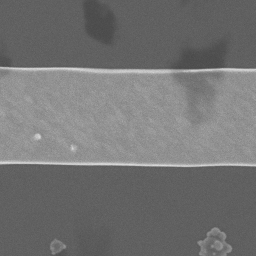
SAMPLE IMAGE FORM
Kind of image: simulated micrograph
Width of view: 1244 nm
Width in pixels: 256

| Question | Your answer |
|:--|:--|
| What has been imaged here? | wiring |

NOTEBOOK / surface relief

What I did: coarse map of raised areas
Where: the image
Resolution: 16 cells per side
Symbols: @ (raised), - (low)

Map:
----------------
----------------
----------------
----------------
@@@@@@@@@@@@@@@@
@@@@@@@@@@@@@@@@
@@@@@@@@@@@@@@@@
@@@@@@@@@@@@@@@@
@@@@@@@@@@@@@@@@
@@@@@@@@@@@@@@@@
----------------
----------------
----------------
----------------
-------------@--
-------------@--